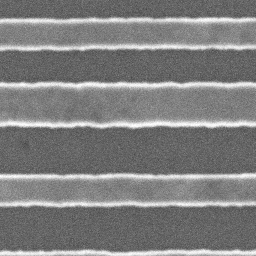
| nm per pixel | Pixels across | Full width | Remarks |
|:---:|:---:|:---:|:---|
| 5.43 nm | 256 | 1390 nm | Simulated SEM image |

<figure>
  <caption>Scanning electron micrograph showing lines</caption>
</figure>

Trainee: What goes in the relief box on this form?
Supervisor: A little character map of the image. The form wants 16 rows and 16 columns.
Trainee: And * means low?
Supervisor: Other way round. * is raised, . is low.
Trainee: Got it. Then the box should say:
................
****************
****************
................
................
****************
****************
****************
................
................
................
****************
****************
................
................
................